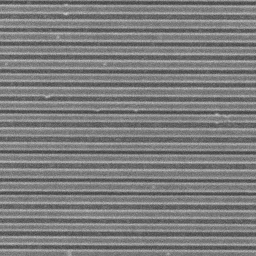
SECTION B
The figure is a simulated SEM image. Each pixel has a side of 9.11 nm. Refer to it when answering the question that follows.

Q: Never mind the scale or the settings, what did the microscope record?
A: parallel lines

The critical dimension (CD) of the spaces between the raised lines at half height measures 45.5 nm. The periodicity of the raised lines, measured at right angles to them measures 124 nanometres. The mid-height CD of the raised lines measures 71.7 nm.